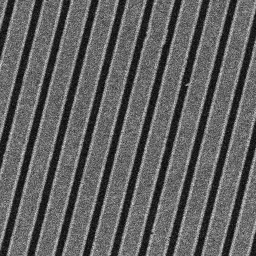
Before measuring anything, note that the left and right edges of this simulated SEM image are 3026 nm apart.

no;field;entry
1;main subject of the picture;parallel lines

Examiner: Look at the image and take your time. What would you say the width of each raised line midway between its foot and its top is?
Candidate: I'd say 211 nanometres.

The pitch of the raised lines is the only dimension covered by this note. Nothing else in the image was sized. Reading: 318 nanometers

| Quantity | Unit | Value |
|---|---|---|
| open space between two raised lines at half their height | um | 0.11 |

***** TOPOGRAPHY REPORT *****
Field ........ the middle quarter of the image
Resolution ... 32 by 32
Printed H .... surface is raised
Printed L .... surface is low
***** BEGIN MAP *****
HHLLLHHHHLLLHHHHLLLHHHHLLLHHHHLL
HHLLLHHHHLLLHHHHLLHHHHHLLHHHHHLL
HHLLHHHHHLLHHHHHLLHHHHHLLHHHHHLL
HHLLHHHHHLLHHHHHLLHHHHLLLHHHHLLL
HLLLHHHHLLLHHHHLLLHHHHLLLHHHHLLL
HLLLHHHHLLLHHHHLLHHHHHLLHHHHHLLH
HLLHHHHHLLHHHHHLLHHHHHLLHHHHHLLH
HLLHHHHHLLHHHHHLLHHHHLLLHHHHLLLH
LLLHHHHLLLHHHHLLLHHHHLLLHHHHLLLH
LLLHHHHLLLHHHHLLHHHHHLLHHHHHLLHH
LLHHHHHLLHHHHHLLHHHHHLLHHHHHLLHH
LLHHHHHLLHHHHHLLHHHHLLLHHHHLLLHH
LLHHHHLLLHHHHLLLHHHHLLLHHHHLLLHH
LLHHHHLLLHHHHLLHHHHHLLHHHHHLLHHH
LHHHHHLLHHHHHLLHHHHHLLHHHHHLLHHH
LHHHHHLLHHHHHLLHHHHLLLHHHHLLLHHH
LHHHHLLLHHHHLLLHHHHLLLHHHHLLLHHH
LHHHHLLLHHHHLLHHHHHLLHHHHHLLHHHH
HHHHHLLHHHHHLLHHHHHLLHHHHHLLHHHH
HHHHHLLHHHHHLLHHHHLLLHHHHLLLHHHH
HHHHLLLHHHHLLLHHHHLLLHHHHLLLHHHH
HHHHLLLHHHHLLHHHHHLLHHHHHLLHHHHH
HHHHLLHHHHHLLHHHHHLLHHHHHLLHHHHL
HHHHLLHHHHHLLHHHHLLLHHHHLLLHHHHL
HHHLLLHHHHLLLHHHHLLLHHHHLLLHHHHL
HHHLLLHHHHLLLHHHHLLHHHHHLLHHHHHL
HHHLLHHHHHLLHHHHHLLHHHHHLLHHHHHL
HHHLLHHHHHLLHHHHLLLHHHHLLLHHHHLL
HHLLLHHHHLLLHHHHLLLHHHHLLLHHHHLL
HHLLHHHHHLLHHHHHLLHHHHHLLHHHHHLL
HHLLHHHHHLLHHHHHLLHHHHHLLHHHHLLL
HHLLHHHHHLLHHHHLLLHHHHLLLHHHHLLL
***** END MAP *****